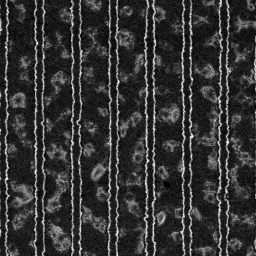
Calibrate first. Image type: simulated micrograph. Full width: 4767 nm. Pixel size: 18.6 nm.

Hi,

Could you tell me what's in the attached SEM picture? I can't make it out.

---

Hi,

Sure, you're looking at parallel lines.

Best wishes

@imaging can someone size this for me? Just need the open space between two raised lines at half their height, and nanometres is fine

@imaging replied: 535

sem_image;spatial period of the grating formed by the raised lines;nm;685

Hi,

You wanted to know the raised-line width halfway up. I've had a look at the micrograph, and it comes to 142 nm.